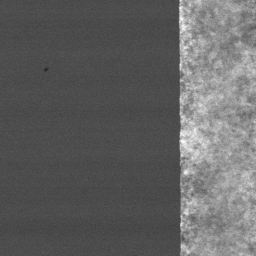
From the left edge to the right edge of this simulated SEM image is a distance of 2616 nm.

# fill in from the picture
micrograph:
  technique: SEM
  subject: one or a few lines or trenches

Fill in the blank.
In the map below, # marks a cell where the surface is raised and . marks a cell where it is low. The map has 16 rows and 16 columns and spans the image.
...........#####
...........#####
...........#####
...........#####
...........#####
...........#####
...........#####
...........#####
...........#####
...........#####
...........#####
...........#####
...........#####
...........#####
...........#####
...........#####